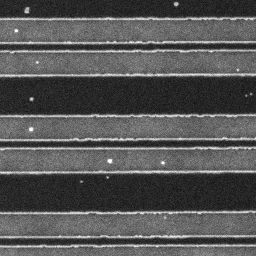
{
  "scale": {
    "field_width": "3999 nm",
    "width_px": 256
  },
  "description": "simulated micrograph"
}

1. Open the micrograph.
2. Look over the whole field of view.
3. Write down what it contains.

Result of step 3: lines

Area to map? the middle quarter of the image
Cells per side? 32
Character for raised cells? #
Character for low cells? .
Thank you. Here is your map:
................................
................................
................................
################################
################################
################################
################################
################################
################################
################################
################################
################################
################################
................................
................................
................................
................................
................................
................................
################################
################################
................................
................................
................................
................................
................................
................................
################################
################################
################################
################################
################################